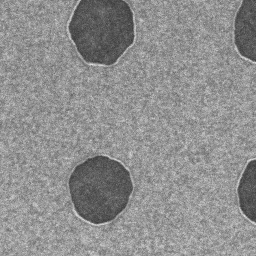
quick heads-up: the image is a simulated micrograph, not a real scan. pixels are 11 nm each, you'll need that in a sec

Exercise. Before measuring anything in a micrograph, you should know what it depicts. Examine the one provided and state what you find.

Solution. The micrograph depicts holes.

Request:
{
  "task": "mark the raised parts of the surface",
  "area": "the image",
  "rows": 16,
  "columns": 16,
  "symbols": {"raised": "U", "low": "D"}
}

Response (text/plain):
UUUUUDDDUUUUUUUD
UUUUDDDDUUUUUUUD
UUUUUDDDUUUUUUUD
UUUUUDDDUUUUUUUD
UUUUUUUUUUUUUUUU
UUUUUUUUUUUUUUUU
UUUUUUUUUUUUUUUU
UUUUUUUUUUUUUUUU
UUUUUUUUUUUUUUUU
UUUUUUUUUUUUUUUU
UUUUUDDDUUUUUUUD
UUUUDDDDUUUUUUUD
UUUUDDDDUUUUUUUD
UUUUUDDUUUUUUUUD
UUUUUUUUUUUUUUUU
UUUUUUUUUUUUUUUU